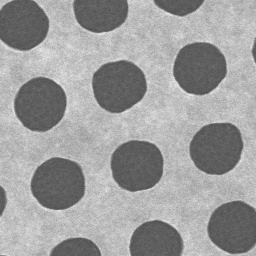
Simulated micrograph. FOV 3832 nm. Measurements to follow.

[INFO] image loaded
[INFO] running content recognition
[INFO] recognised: holes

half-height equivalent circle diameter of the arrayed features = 53.2 px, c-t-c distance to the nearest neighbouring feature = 1.21 microns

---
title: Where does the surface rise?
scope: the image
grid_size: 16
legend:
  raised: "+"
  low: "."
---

...++...++..++++
...++...++++++++
...+++++++++++++
+++++++++++...++
++++++...++...++
+...++...++..+++
+...++..++++++++
+...++++++++++++
++++++++++++...+
+++++++...++...+
++...++...++...+
++...++...++++++
++...+++++++++++
+++++++++++++...
++++++++...++...
+++...++...+++..